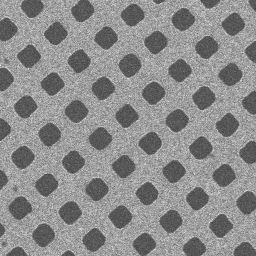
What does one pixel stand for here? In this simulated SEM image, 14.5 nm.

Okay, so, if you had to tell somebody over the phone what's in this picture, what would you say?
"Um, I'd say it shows a regular array of holes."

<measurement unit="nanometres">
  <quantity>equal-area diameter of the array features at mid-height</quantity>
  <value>320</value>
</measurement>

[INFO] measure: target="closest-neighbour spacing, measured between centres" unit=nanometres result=509